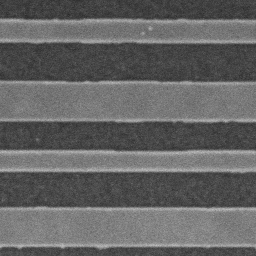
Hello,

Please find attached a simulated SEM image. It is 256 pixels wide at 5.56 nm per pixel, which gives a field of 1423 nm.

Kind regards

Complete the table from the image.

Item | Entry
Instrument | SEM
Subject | lines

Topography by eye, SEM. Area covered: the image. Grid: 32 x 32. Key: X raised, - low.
--------------------------------
--------------------------------
XXX---------XXXXX-----X---------
XXXXXXXXXXXXXXXXXXXXXXXXXXXXXXXX
XXXXXXXXXXXXXXXXXXXXXXXXXXXXXXXX
--------------------------------
--------------------------------
--------------------------------
--------------------------------
--------------------------------
XXXXXXXXXXXXXXXXXXXXXXXXXXXXXXXX
XXXXXXXXXXXXXXXXXXXXXXXXXXXXXXXX
XXXXXXXXXXXXXXXXXXXXXXXXXXXXXXXX
XXXXXXXXXXXXXXXXXXXXXXXXXXXXXXXX
XXXXXXXXXXXXXXXXXXXXXXXXXXXXXXXX
--------------------------------
--------------------------------
--------------------------------
--------------------------------
XXXXXXXXXXXXXXXXXXXXXXXXXXXXXXXX
XXXXXXXXXXXXXXXXXXXXXXXXXXXXXXXX
--------------------------------
--------------------------------
--------------------------------
--------------------------------
--------------------------------
XXXXXXXXXXXXXXXXXXXXXXXXXXXXXXXX
XXXXXXXXXXXXXXXXXXXXXXXXXXXXXXXX
XXXXXXXXXXXXXXXXXXXXXXXXXXXXXXXX
XXXXXXXXXXXXXXXXXXXXXXXXXXXXXXXX
XXXXXXXXXXXXXXXXXXXXXXXXXXXXXXXX
--------------------------------